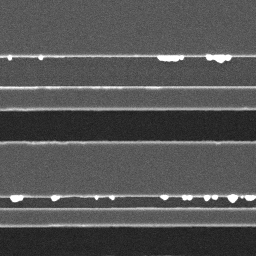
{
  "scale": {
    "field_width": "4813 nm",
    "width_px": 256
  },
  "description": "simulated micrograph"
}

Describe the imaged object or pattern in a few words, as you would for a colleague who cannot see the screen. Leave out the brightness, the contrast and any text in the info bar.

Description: lines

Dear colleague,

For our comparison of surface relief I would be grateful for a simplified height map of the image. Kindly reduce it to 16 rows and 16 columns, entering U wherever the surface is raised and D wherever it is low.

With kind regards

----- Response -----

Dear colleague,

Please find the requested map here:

UUUUUUUUUUUUUUUU
UUUUUUUUUUUUUUUU
UUUUUUUUUUUUUUUU
UUUUUUUUUUUUUUUU
UUUUUUUUUUUUUUUU
UUUUUUUUUUUUUUUU
UUUUUUUUUUUUUUUU
DDDDDDDDDDDDDDDD
DDDDDDDDDDDDDDDD
UUUUUUUUUUUUUUUU
UUUUUUUUUUUUUUUU
UUUUUUUUUUUUUUUU
UUUUUUUUUUUUUUUU
UUUUUUUUUUUUUUUU
DDDDDDDDDDDDDDDD
DDDDDDDDDDDDDDDD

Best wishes